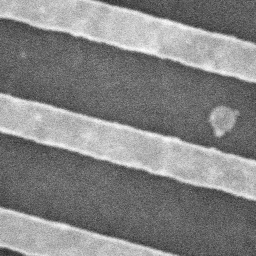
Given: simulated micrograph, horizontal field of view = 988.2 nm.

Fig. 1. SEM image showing lines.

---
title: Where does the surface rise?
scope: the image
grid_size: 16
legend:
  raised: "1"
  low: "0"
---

1111111100000000
0011111111100000
0000001111111110
0000000000111111
0000000000000111
0000000000000000
1110000000000000
1111110000000000
0111111111000000
0000011111111100
0000000001111111
0000000000001111
0000000000000000
1100000000000000
1111110000000000
1111111110000000